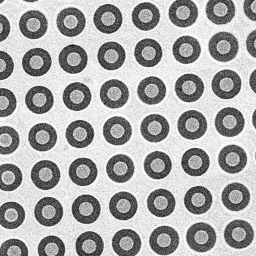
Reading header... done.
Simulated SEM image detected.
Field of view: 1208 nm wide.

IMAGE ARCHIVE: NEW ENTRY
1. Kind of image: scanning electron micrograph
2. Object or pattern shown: an array of small figures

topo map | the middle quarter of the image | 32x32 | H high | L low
LLLLLLHHHLLLLLLHHHHLLLLHHHHHHHHH
LLLLLHHHHHHLLHHHHHHHHHHHHHHHHHHH
HHLHHHHHHHHHHHHHHHHHHHHHHHHHHHLL
HHHHHHHHHHHHHHHHHHHHLLLLHHHHHLLL
HHHLHHHHHHLLLLLHHHHLLLLLLHHHLLLH
HLLLLLHHHLLLLLLLHHLLLHHLLLHHLLHH
LLLLLLLHHLLHHHLLHHLLHHHHLLHLLLHH
LLHHHLLHHLLHHHLLLHLLHHHLLLHHLLLL
LLHHHLLHHLLLHHLLHHHLLLLLLHHHLLLL
LLHHLLLHHLLLLLLLHHHLLLLLHHHHHHLL
LLLLLLHHHHLLLLLHHHHHHHHHHHHHHHHH
HHLLLHHHHHHHLHHHHHHHHHHHHHHHHHHL
HHHHHHHHHHHHHHHHHHHHHLLLHHHHHLLL
HHHHHHHHHHHLLLLLHHHHLLLLLLHHHLLL
HHLLLLHHHHLLLLLLLHHLLLHLLLHHLLLH
HLLLLLLHHHLLHHLLLHHLLHHHLLLHLLHH
LLLHHLLHHLLLHHHLLHHLLHHHLLLHLLLH
LLHHHHLLHHLLHHHLLHHLLLHHLLHHHLLL
LLLHHLLLHHLLLLLLLHHHLLLLLLHHHHLL
HLLLLLLHHHHLLLLLHHHHHLLLHHHHHHHH
HHLLLLHHHHHHHLLHHHHHHHHHHHHHHHHH
HHHHHHHHHHHHHHHHHHHHHHHHHHHHHHHL
HHHHHHHHHHHHHLLLHHHHHLLLLLHHHHLL
HHHLLLHHHHHLLLLLLHHHLLLLLLLHHLLL
HHLLLLLHHHHLLLLLLLHHLLHHHLLHHLLH
HLLLHLLLHHLLLHHHLLHHLLHHHLLHHLLH
HLLHHHLLHHLLLHHHLLHHLLHHLLLHHHLL
HLLHHHLLLHHLLHHLLLHHLLLLLLHHHHHL
HLLLHLLLHHHLLLLLLHHHHLLLLHHHHHHH
HHLLLLLHHHHHLLLLHHHHHHHHHHHHHHHH
HHHHLLHHHHHHHHHHHHHHHHHHHHHHHHHH
HHHHHHHHHHHHHHHHHHHHHHLLLLHHHHHL